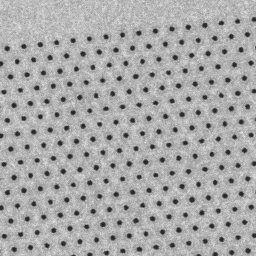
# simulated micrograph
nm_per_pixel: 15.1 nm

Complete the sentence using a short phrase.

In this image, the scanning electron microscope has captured a regular array of holes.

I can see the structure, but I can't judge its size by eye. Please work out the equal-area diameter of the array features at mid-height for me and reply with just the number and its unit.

83.3 nm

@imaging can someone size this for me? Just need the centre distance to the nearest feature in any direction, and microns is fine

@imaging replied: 0.244